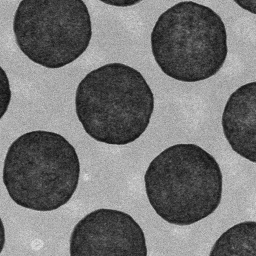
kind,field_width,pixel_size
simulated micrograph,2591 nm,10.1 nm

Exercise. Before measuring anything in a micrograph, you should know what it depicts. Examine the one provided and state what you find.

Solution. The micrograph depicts holes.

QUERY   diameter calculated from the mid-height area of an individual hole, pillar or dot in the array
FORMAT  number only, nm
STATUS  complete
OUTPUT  801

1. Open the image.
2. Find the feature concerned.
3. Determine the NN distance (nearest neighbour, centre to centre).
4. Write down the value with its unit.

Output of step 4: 98.3 px